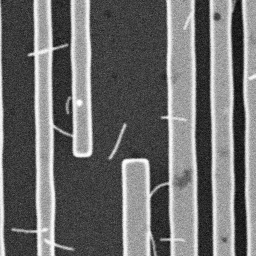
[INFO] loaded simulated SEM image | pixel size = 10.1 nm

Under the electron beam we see groups of lines, slits or small figures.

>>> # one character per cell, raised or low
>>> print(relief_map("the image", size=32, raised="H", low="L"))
LLLLHHLLLHHLLLLLLLLLLHHHLLHHHLHH
LLLLHHLLLHHLLLLLLLLLLHHHLLHHHLHH
LLLLHHLLLHHLLLLLLLLLLHHHLLHHHLHH
LLLLHHLLLHHLLLLLLLLLLHHHLLHHHLHH
LLLLHHLLLHHLLLLLLLLLLHHHLLHHHLLH
LLLLHHLLLHHLLLLLLLLLLHHHLLHHHLLH
LLLLHHHLLHHLLLLLLLLLLHHHLLHHHLLH
LLLLHHLLLHHLLLLLLLLLLHHHLLHHHLLH
LLLLHHLLLHHLLLLLLLLLLHHHLLHHHLLH
LLLLHHLLLHHLLLLLLLLLLHHHLLHHHLLH
LLLLHHLLLHHLLLLLLLLLLHHHLLHHHLHH
LLLLHHLLLHHLLLLLLLLLLHHHLLHHHLHH
LLLLHHLLLHHLLLLLLLLLLHHHLLHHHLLH
LLLLHHLLLHHLLLLLLLLLLHHHLLHHHLLH
LLLLHHLLLHHLLLLLLLLLLHHHLLLHHLLH
LLLLLHHLLHHLLLLLLLLLLHHHLLLHHLLH
LLLLLHHLLHHLLLLLLLLLLHHHLLLHHLLH
LLLLLHHLLHHLLLLLLLLLLHHHLLLHHLLH
LLLLLHHLLHHLLLLLLLLLLHHHLLLHHLLH
LLLLLHHLLLLLLLLLLLLLLHHHLLLHHLLH
LLLLLHHLLLLLLLLHHHLLLHHHLLLHHLLH
LLLLLHHLLLLLLLLHHHLLLHHHLLLHHLLH
LLLLLHHLLLLLLLLHHHHLLHHHLLLHHLLH
LLLLLHHLLLLLLLLHHHHLLHHHLLLHHLLH
LLLLLHHLLLLLLLLHHHHLLHHHLLLHHLLH
LLLLLHHLLLLLLLLHHHHLLHHHLLLHHLLH
LLLLLHHLLLLLLLLHHHHLLHHHHLLHHLLH
LLLLLHHLLLLLLLLHHHHLLHHHHLLHHLLH
LLLLLHHLLLLLLLLHHHHLLHHHHLLHHLLH
LLLLLHHLLLLLLLLLHHHLLHHHHLLHHLLH
LLLLLHHLLLLLLLLLHHHLLHHHHLLHHLLH
LLLLLHHLLLLLLLLLHHHLLHHHHLLHHLLH